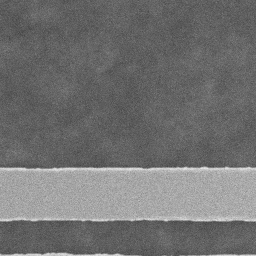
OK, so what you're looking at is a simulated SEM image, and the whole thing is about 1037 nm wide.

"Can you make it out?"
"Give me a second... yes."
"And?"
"lines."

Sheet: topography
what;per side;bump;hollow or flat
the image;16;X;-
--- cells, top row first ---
----------------
----------------
----------------
----------------
----------------
----------------
----------------
----------------
----------------
----------------
------------X---
XXXXXXXXXXXXXXXX
XXXXXXXXXXXXXXXX
XXXXXXXXXXXXXXXX
----------------
----------------